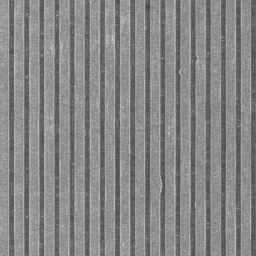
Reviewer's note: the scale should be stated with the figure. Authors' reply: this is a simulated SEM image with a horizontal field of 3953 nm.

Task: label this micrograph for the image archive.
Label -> parallel lines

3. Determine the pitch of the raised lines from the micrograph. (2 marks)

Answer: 233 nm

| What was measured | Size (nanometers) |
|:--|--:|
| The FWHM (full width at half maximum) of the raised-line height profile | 147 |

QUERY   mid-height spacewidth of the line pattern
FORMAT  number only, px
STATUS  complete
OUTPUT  5.63